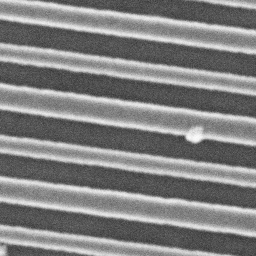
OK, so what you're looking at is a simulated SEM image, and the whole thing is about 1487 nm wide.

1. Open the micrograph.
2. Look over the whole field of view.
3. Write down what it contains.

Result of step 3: lines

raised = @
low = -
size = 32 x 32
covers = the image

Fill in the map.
@@@@@@@---------------------@@@@
@@@@@@@@@@@@@@------------------
-@@@@@@@@@@@@@@@@@@@@-----------
---------@@@@@@@@@@@@@@@@@@@@@--
----------------@@@@@@@@@@@@@@@@
-----------------------@@@@@@@@@
@@@@@@@@-----------------------@
@@@@@@@@@@@@@@@-----------------
-------@@@@@@@@@@@@@@@----------
--------------@@@@@@@@@@@@@@@---
----------------------@@@@@@@@@@
@@@@@@@-----------------------@@
@@@@@@@@@@@@@@------------------
@@@@@@@@@@@@@@@@@@@@@-----------
-------@@@@@@@@@@@@@@@@@@@@@@---
-------------@@@@@@@@@@@@@@@@@@@
--------------------@@@@@@@@@@@@
@@@@--------------------@---@@@@
@@@@@@@@@@@@--------------------
---@@@@@@@@@@@@@@@@-------------
-----------@@@@@@@@@@@@@@@------
------------------@@@@@@@@@@@@@@
@@------------------------@@@@@@
@@@@@@@@@@----------------------
@@@@@@@@@@@@@@@@@@--------------
---@@@@@@@@@@@@@@@@@@@@@@@------
----------@@@@@@@@@@@@@@@@@@@@@@
-----------------@@@@@@@@@@@@@@@
@@@----------------------@@@@@@@
@@@@@@@@@@----------------------
--@@@@@@@@@@@@@@@---------------
----------@@@@@@@@@@@@@@@-------